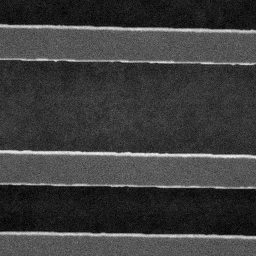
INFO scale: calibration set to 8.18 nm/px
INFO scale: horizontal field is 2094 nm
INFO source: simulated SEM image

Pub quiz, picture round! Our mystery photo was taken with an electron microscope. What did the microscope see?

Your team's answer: lines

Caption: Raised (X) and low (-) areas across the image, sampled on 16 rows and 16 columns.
----------------
----------------
XXXXXXXXXXXXXXXX
XXXXXXXXXXXXXXXX
----------------
----------------
----------------
----------------
----------------
XXXXX-----------
XXXXXXXXXXXXXXXX
XXXXXXXXXXXXXXXX
----------------
----------------
----------------
XXXXXXXXXXXXXXXX